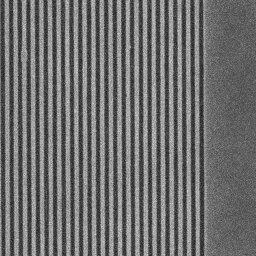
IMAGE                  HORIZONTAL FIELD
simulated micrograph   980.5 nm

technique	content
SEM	parallel lines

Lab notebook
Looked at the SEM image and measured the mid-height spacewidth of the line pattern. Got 0.0177 micrometres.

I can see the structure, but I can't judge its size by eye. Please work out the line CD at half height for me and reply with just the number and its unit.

14.4 nm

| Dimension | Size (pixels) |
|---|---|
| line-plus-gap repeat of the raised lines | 8.64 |